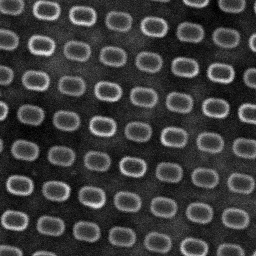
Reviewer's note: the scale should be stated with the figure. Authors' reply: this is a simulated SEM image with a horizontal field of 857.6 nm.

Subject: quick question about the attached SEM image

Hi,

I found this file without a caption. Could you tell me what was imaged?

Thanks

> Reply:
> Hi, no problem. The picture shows a regular array of raised bodies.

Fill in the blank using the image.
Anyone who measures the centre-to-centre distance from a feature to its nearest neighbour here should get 0.118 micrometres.